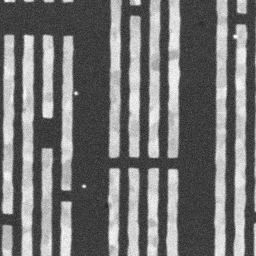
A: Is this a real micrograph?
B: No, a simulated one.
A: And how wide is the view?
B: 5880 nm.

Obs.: groups of lines, slits or small figures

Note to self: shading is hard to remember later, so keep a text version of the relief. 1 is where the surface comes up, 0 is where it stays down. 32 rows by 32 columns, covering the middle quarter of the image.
11000000000011000110001100111000
11000000000011000110001100111000
11000000000011000110001100111000
11000000000011000110001100111000
11000000000011000110001100111000
11000000000011000110011100110000
11000000000011000110011100110000
11000000000011000110001100110000
11000000000011000110001100110000
11000000000011000110001100110000
11000000000011000110011100110000
11000000000011000110011100110000
11000000000011000110011100111000
11000000000011000110011100111000
11000000000011001110011100111000
11000000000011001110011000110000
11000000000011001110011000111000
11000000000011001110011000111000
11000000000011000110011000110000
11000000000011000110011000110000
11000000000011000110011000110000
11000000000111000110011000110000
11000000000111000110011000110000
11000000000000000000000000000000
11000000000000000000000000000000
11000000000000000000000000000000
11000000000011001100011000000000
11000000000011001110011000110000
11000000000011001110011000110000
11000000000011000110011000110000
11000000000011000110011000110000
00000000000011000110011000110000